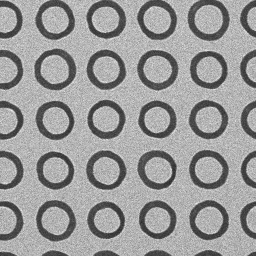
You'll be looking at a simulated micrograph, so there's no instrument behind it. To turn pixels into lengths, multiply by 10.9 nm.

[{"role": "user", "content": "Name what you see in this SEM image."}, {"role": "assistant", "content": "a regular array of ring-shaped grooves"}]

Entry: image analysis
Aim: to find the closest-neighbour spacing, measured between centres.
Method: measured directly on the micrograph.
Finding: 542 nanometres